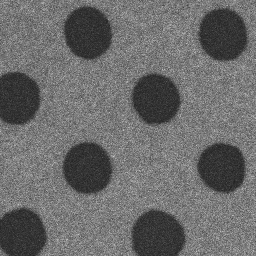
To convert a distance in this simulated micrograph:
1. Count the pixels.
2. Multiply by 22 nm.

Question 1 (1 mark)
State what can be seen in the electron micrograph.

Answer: holes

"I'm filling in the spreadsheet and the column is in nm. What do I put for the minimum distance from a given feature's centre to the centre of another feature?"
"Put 2090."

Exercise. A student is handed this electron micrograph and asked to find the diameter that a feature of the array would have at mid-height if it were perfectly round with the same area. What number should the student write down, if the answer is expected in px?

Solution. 51